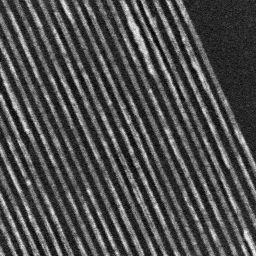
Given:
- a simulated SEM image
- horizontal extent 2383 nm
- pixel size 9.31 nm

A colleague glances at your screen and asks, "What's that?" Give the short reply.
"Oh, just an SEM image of parallel lines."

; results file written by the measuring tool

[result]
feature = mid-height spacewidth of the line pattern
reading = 0.0637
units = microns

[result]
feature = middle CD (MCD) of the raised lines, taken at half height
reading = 36.1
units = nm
